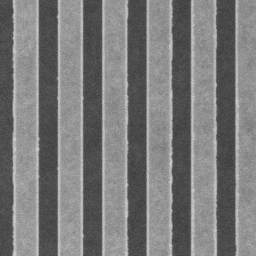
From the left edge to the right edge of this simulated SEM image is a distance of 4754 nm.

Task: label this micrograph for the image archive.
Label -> lines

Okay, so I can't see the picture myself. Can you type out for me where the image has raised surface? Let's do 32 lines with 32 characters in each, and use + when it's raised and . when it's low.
..+++..+++...+++..+++...+++...++
..+++..+++...+++..+++...+++...++
..+++..+++...+++..+++...+++...++
..+++..+++...+++..+++...+++...++
..+++..+++...+++..+++...+++...++
..+++..+++...+++..+++...+++...++
..+++..+++...+++..+++...+++...++
..+++..+++...+++..+++...+++...++
..+++..+++...+++..+++...+++...++
..+++..+++...+++..+++...+++...++
..+++..+++...+++..+++...+++...++
..+++..+++...+++..+++...+++...++
..+++..+++...+++..+++...+++...++
..+++..+++...+++..+++...+++...++
..+++..+++...+++..+++...+++...++
..+++..+++...+++..+++...+++...++
..+++..+++...+++..+++...+++...++
..+++..+++...+++..+++...+++...++
..+++..+++...+++..+++...+++...++
..+++..+++...+++..+++...+++...++
..+++..+++...+++..+++...+++...++
..+++..+++...+++..+++...+++...++
..+++..+++...+++..+++...+++...++
..+++..+++...+++..+++...+++...++
..+++..+++...+++..+++...+++...++
..+++..+++...+++..+++...+++...++
..+++..+++...+++..+++...+++...++
..+++..+++...+++..+++...+++...++
..+++..+++...+++..+++...+++...++
..+++..+++...+++..+++...+++...++
..+++..+++...+++..+++...+++...++
..+++..+++...+++..+++...+++...++